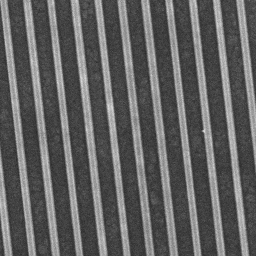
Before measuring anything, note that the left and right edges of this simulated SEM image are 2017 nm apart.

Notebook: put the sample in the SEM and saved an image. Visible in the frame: parallel lines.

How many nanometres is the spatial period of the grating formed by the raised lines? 185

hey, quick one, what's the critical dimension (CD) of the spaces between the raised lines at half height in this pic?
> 136 nm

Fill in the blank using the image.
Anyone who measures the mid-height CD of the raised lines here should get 0.0498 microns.